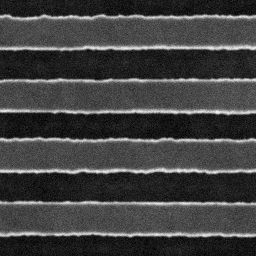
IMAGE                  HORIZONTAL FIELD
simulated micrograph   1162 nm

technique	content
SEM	lines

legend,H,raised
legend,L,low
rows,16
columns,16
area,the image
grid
LLLLLLLLLLLLLLLL
HHHHHHHHHHHHHHHH
HHHHHHHHHHHHHHHH
LLLLLLLLLLLLLLLL
LLLLLLLLLLLLLLLL
HHHHHHHHHHHHHHHH
HHHHHHHHHHHHHHHH
LLLLLLLLLLLLLLLL
LLLLLLLLLLLLLLLL
HHHHHHHHHHHHHHHH
HHHHHHHHHHHHHHHH
LLLLLLLLLLLLLLLL
LLLLLLLLLLLLLLLL
HHHHHHHHHHHHHHHH
HHHHHHHHHHHHHHHH
LLLLLLLLLLLLLLLL